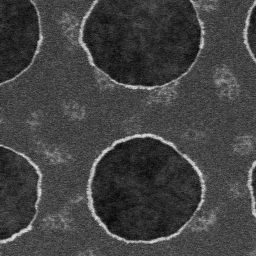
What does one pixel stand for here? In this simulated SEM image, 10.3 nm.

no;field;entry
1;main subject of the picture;holes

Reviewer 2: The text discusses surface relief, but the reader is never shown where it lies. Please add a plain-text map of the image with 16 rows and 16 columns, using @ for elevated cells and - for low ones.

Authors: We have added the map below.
--@@@@------@@@@
--@@@-------@@@-
--@@@--------@@-
--@@@@------@@@@
-@@@@@------@@@@
@@@@@@@@@@@@@@@@
@@@@@@@@@@@@@@@@
@@@@@@@@@@@@@@@@
@@@@@@@@@@@@@@@@
-@@@@@@----@@@@@
--@@@@------@@@@
--@@@@-------@@@
--@@@@-------@@@
--@@@@------@@@@
-@@@@@@----@@@@@
@@@@@@@@@@@@@@@@